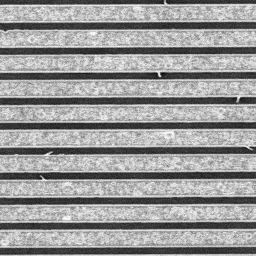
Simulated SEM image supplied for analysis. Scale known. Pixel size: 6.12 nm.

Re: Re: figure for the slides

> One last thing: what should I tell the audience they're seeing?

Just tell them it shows parallel lines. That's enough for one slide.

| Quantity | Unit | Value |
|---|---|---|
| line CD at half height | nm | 106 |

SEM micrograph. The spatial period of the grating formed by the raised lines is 153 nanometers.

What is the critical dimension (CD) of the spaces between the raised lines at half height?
7.88 pixels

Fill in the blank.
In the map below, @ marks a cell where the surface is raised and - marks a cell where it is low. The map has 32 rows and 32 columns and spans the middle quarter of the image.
@@@@@@@@@@@@@@@@@@@@@@@@@@@@@@@@
@@@@@@@@@@@@@@@@@@@@@@@@@@@@@@@@
--------------------------------
--------------------------------
@@@@@@@@@@@@@@@@@@@@@@@@@@@@@@@@
@@@@@@@@@@@@@@@@@@@@@@@@@@@@@@@@
@@@@@@@@@@@@@@@@@@@@@@@@@@@@@@@@
@@@@@@@@@@@@@@@@@@@@@@@@@@@@@@@@
--------------------------------
--------------------------------
@@@@@@@@@@@@@@@@@@@@@@@@@@@@@@@@
@@@@@@@@@@@@@@@@@@@@@@@@@@@@@@@@
@@@@@@@@@@@@@@@@@@@@@@@@@@@@@@@@
@@@@@@@@@@@@@@@@@@@@@@@@@@@@@@@@
--------------------------------
--------------------------------
--------------------------------
@@@@@@@@@@@@@@@@@@@@@@@@@@@@@@@@
@@@@@@@@@@@@@@@@@@@@@@@@@@@@@@@@
@@@@@@@@@@@@@@@@@@@@@@@@@@@@@@@@
@@@@@@@@@@@@@@@@@@@@@-----------
--------------------------------
--------------------------------
@@@@@@@@@@@@@@@@@@@@@@@@@@@@@@@@
@@@@@@@@@@@@@@@@@@@@@@@@@@@@@@@@
@@@@@@@@@@@@@@@@@@@@@@@@@@@@@@@@
@@@@@@@@@@@@@@@@@@@@@@@@@@@@@@@@
--------------------------------
--------------------------------
@@@@@@@@@@@@@@@@@@@@@@@@@@@@@@@@
@@@@@@@@@@@@@@@@@@@@@@@@@@@@@@@@
@@@@@@@@@@@@@@@@@@@@@@@@@@@@@@@@